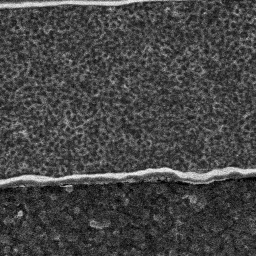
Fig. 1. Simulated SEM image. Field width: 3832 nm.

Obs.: one or a few lines or trenches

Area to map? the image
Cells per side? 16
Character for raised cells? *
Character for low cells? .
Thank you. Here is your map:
****************
****************
****************
****************
****************
****************
****************
****************
****************
****************
****************
................
................
................
................
................